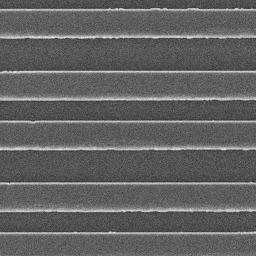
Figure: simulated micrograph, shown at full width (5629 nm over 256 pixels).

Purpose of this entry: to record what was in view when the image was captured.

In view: lines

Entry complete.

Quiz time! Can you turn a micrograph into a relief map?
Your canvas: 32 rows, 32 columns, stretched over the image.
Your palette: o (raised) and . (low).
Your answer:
................................
oooooooooooooooooooooooooooooooo
oooooooooooooooooooooooooooooooo
oooooooooooooooooooooooooooooooo
oooooooooooooooooooooooooooooooo
................................
................................
................................
................................
oooooooooooooooooooooooooooooooo
oooooooooooooooooooooooooooooooo
oooooooooooooooooooooooooooooooo
................................
................................
................................
oooooooooooooooooooooooooooooooo
oooooooooooooooooooooooooooooooo
oooooooooooooooooooooooooooooooo
oooooooooooooooooooooooooooooooo
................................
................................
................................
................................
oooooooooooooooooooooooooooooooo
oooooooooooooooooooooooooooooooo
oooooooooooooooooooooooooooooooo
................................
................................
................................
oooooooooooooooooooooooooooooooo
oooooooooooooooooooooooooooooooo
oooooooooooooooooooooooooooooooo